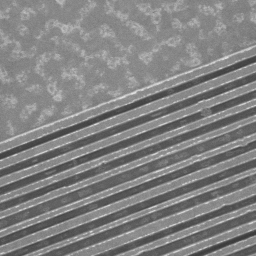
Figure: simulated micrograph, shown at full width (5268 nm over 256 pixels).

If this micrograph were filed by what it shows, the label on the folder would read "parallel lines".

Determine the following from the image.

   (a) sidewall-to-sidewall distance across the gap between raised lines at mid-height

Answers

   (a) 0.175 µm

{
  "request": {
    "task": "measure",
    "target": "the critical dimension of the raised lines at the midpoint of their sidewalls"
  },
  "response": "159 nanometers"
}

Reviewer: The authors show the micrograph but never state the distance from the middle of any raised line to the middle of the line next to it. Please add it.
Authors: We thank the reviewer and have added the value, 331 nm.